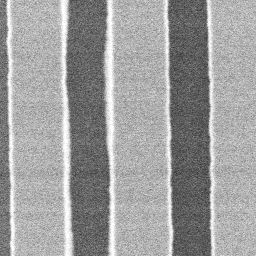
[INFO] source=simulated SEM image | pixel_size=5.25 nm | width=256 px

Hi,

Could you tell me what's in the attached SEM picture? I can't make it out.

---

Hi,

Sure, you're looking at lines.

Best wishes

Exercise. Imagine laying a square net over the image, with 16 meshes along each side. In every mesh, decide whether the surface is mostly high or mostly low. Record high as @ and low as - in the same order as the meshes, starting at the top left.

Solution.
-@@@---@@@---@@@
-@@@---@@@---@@@
-@@@---@@@---@@@
-@@@---@@@---@@@
-@@@---@@@---@@@
-@@@---@@@@--@@@
-@@@---@@@@--@@@
-@@@---@@@@--@@@
-@@@---@@@@--@@@
-@@@---@@@@--@@@
-@@@---@@@@--@@@
-@@@---@@@@--@@@
-@@@---@@@@--@@@
-@@@---@@@@--@@@
-@@@---@@@@--@@@
-@@@---@@@@--@@@